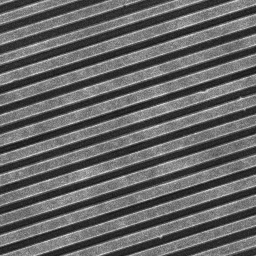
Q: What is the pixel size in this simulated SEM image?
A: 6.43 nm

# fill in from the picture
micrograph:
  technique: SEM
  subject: parallel lines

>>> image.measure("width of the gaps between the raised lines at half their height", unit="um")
0.0514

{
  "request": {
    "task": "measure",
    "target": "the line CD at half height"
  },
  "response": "70.6 nm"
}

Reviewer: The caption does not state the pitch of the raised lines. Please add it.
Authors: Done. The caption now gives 123 nanometres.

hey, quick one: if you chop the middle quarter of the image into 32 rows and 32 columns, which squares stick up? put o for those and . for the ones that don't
......oooooooooo.......ooooooooo
...oooooooooo.......ooooooooo...
oooooooooo......ooooooooo.......
ooooooo......ooooooooo.......ooo
ooo.......ooooooooo.......oooooo
.......ooooooooo.......ooooooooo
....ooooooooo......oooooooooo...
.ooooooooo......oooooooooo......
oooooo.......oooooooooo......ooo
ooo.......oooooooooo.....ooooooo
.......oooooooooo.....ooooooooo.
....ooooooooo......ooooooooo....
oooooooooo......ooooooooo.......
ooooooo......ooooooooo......oooo
oooo......ooooooooo......ooooooo
o.....oooooooooo......oooooooooo
...ooooooooo.......oooooooooo...
ooooooooo.......oooooooooo......
oooooo.......ooooooooo.......ooo
ooo......oooooooooo.......oooooo
......oooooooooo.......ooooooooo
...oooooooooo.......ooooooooo...
oooooooooo......ooooooooo.......
ooooooo......ooooooooo.......ooo
ooo.......ooooooooo.......oooooo
.......ooooooooo.......ooooooooo
....ooooooooo......oooooooooo...
.ooooooooo......oooooooooo......
oooooo.......oooooooooo.......oo
ooo.......oooooooooo......oooooo
.......oooooooooo......ooooooooo
....ooooooooo......oooooooooo...